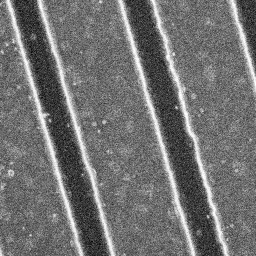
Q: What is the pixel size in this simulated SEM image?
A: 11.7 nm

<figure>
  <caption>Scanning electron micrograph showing one or a few lines or trenches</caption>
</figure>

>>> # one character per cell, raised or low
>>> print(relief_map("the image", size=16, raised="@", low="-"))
@--@@@@@--@@@@@-
@--@@@@@--@@@@@-
@--@@@@@--@@@@@-
@--@@@@@---@@@@-
@@--@@@@@--@@@@@
@@--@@@@@--@@@@@
@@--@@@@@--@@@@@
@@@--@@@@@--@@@@
@@@--@@@@@--@@@@
@@@--@@@@@--@@@@
@@@@--@@@@@--@@@
@@@@--@@@@@--@@@
@@@@--@@@@@--@@@
@@@@--@@@@@--@@@
@@@@@--@@@@@--@@
@@@@@--@@@@@--@@